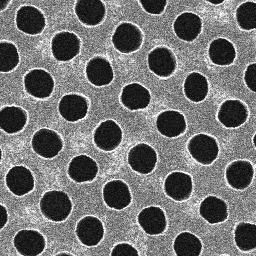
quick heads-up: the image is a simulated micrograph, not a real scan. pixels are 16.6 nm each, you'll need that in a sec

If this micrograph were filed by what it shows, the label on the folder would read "a regular array of holes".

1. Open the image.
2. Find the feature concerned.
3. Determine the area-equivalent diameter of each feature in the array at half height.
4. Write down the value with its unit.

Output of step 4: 0.462 microns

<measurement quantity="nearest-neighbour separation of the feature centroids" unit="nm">711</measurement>